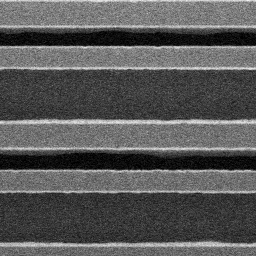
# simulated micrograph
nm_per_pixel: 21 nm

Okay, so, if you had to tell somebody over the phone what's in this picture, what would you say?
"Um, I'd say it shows lines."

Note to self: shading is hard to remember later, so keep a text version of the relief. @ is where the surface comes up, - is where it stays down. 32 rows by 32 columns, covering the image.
@@@@@@@@@@@@@@@@@@@@@@@@@@@@@@@@
@@@@@@@@@@@@@@@@@@@@@@@@@@@@@@@@
@@@@@@@@@@@@@@@@@@@@@@@@@@@@@@@@
@@@--@@@@@@@----@@@@-@@@@@@@-@@@
--------------------------------
--------------------------------
@@@@@@@@@@@@@@@@@@@@@@@@@@@@@@@@
@@@@@@@@@@@@@@@@@@@@@@@@@@@@@@@@
@@@@@@@@@@@@@@@@@@@@@@@@@@@@@@@@
--------------------------------
--------------------------------
--------------------------------
--------------------------------
--------------------------------
--------------------------------
@@@@@@@@@@@@@@@@@@@@@@@@@@@@@@@@
@@@@@@@@@@@@@@@@@@@@@@@@@@@@@@@@
@@@@@@@@@@@@@@@@@@@@@@@@@@@@@@@@
@@@@@@@@@@@@@@@@@@@@@@@@@@@@@@@@
--------------------------------
--------------------------------
@@@@@@@@@@@@@@@@@@@@@@@@@@@@@@@@
@@@@@@@@@@@@@@@@@@@@@@@@@@@@@@@@
@@@@@@@@@@@@@@@@@@@@@@@@@@@@@@@@
--------------------------------
--------------------------------
--------------------------------
--------------------------------
--------------------------------
--------------------------------
--------------------------------
@@@@@@@@@@@@@@@@@@@@@@@@@@@@@@@@